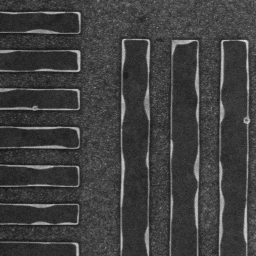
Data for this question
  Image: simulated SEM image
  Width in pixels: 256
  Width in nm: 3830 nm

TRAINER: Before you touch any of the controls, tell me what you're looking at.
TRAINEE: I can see groups of lines, slits or small figures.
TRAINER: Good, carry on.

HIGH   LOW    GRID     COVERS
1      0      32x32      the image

00000000000000000000000000000000
00000000000000000000000000000000
11111111110000000000000000000000
11111111110000000000000000000000
00000000000000000000000000000000
00000000000000011110001110001110
11111111110000011110001110001110
11111111110000011110001110001110
11111111110000011110001110001110
00000000000000011110001110001110
00000000000000011110001110001110
11111111110000011100011110001110
11111111110000011100011110001110
11111111110000011100011110001110
00000000000000011110011110001110
00000000000000011110011110001110
11111111110000011110011110001110
11111111110000011110011110001110
00000000110000011110011110001110
00000000000000011100011110001110
00000000000000011100011110001110
11111111110000011110011110001110
11111111110000011110011110001110
00000000000000011110011110001110
00000000000000011110011110001110
00000000000000011110011110001110
11111111110000011100011110001110
11111111110000011100011110001110
00000000000000011100011110001110
00000000000000011100011110001110
11111111100000011100011110011110
11111111110000011110011110011110